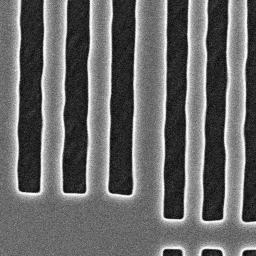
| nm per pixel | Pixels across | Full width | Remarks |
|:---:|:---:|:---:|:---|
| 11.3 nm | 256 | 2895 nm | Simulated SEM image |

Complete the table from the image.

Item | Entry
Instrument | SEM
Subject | groups of lines, slits or small figures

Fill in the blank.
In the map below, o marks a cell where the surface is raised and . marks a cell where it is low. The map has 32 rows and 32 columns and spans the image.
oo....oo...ooo...oooo...oo...oo.
oo....oo...ooo...oooo...oo...oo.
oo....oo...ooo...oooo...oo...oo.
oo....oo...ooo...oooo...oo...oo.
oo....oo...ooo...oooo...oo..ooo.
oo....oo...ooo...oooo...oo..ooo.
oo....oo...ooo...oooo...oo..ooo.
oo....oo...ooo...oooo...oo..ooo.
oo...ooo...ooo...oooo..ooo..ooo.
oo...ooo...ooo...oooo..ooo...oo.
oo...ooo...ooo...oooo..ooo..ooo.
oo...ooo...ooo...oooo..ooo..ooo.
oo...ooo...ooo...oooo..ooo..ooo.
oo...ooo...ooo...oooo..ooo..ooo.
oo...ooo...ooo...oooo..ooo..ooo.
oo...ooo...ooo...oooo..oo...oo..
oo...ooo...ooo...ooo...ooo..oo..
oo...ooo...ooo...ooo...ooo..ooo.
oo...ooo...ooo...oooo..ooo..ooo.
oo...ooo...ooo...oooo..oo...ooo.
oo...ooo...ooo...ooo...oo...ooo.
oo...ooo...oo....ooo...oo...ooo.
oo...ooo...oo....ooo...oo...oo..
oo...ooo...oo....ooo...oo...oo..
oooooooooooooooooooo...oo...oo..
oooooooooooooooooooo...oo...oo..
oooooooooooooooooooo...oo...oo..
ooooooooooooooooooooooooo...oo..
oooooooooooooooooooooooooooooooo
oooooooooooooooooooooooooooooooo
oooooooooooooooooooooooooooooooo
oooooooooooooooooooo...oo...oo..